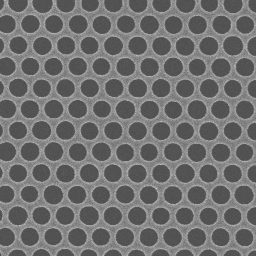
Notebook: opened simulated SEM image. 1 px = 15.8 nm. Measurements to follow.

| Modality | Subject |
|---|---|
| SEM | a regular array of holes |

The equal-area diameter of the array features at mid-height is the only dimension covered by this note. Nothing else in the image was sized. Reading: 289 nm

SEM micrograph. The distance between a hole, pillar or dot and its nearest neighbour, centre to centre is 0.372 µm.